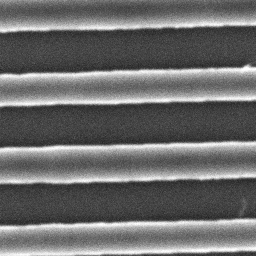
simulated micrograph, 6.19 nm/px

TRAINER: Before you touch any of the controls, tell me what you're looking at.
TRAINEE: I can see lines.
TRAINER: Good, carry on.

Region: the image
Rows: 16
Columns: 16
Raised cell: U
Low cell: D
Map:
UUUUUUUUUUUUUUUU
UUUUUUUUUUUUUUUU
DDDDDDDDDDDDDDDD
DDDDDDDDDDDDDDDD
DDDDDDDUUUUUUUUU
UUUUUUUUUUUUUUUU
UUDDDDDDDDDDDDDD
DDDDDDDDDDDDDDDD
DDDDDDDDDDDDDDDD
UUUUUUUUUUUUUUUU
UUUUUUUUUUUUUUUU
DDDDDDDDDDDDDDDD
DDDDDDDDDDDDDDDD
DDDDDDDDDDDDDDDD
UUUUUUUUUUUUUUUU
UUUUUUUUUUUUUUUU